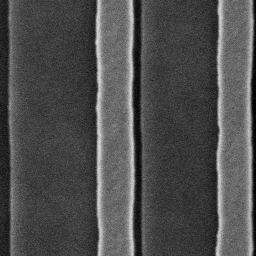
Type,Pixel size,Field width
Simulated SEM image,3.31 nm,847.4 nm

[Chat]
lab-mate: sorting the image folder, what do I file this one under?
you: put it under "lines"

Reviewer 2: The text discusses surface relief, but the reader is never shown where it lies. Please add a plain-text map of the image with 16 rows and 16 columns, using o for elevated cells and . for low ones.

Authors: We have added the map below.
......oo......oo
......oo......oo
......oo......oo
......oo......oo
......oo......oo
......oo......oo
......oo......oo
......oo......oo
......oo......oo
......oo......oo
......oo......oo
......oo......oo
......oo......oo
......oo......oo
......oo......oo
......oo......oo